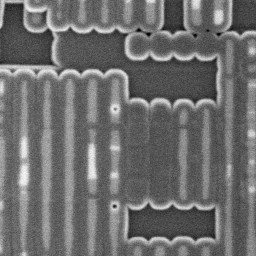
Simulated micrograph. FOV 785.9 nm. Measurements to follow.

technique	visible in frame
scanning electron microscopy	wiring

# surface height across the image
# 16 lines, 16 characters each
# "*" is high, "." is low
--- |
..********..**..
...*******..**..
........********
........********
**..****......**
********......**
****************
****************
****************
****************
****************
****************
****************
********.....***
********.....***
****************